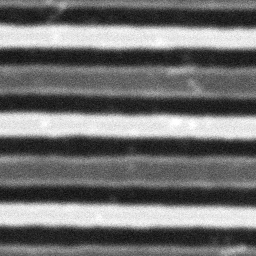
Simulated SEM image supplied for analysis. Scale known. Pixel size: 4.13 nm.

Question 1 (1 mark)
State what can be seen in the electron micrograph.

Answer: lines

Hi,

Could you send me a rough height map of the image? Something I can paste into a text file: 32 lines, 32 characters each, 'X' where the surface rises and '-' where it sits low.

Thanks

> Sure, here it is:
XXXXXXXXXXXXXXXXXXXXXXXXXXXXXXXX
--------------------------------
--------------------------------
XXXXXXXXXXXXXXXXX---------------
XXXXXXXXXXXXXXXXXXXXXXXXXXXXXXXX
XXXXXXXXXXXXXXXXXXXXXXXXXXXXXXXX
--------------------------------
--------------------------------
XXXXXXXX----------X-------------
XXXXXXXXXXXXXXXXXXXXXXXXXXXXXXXX
XXXXXXXXXXXXXXXXXXXXXXXXXXXXXXXX
XXXXXXXXXXXXXXXXXXXXXXXXXXXXXXXX
--------------------------------
--------------------------------
XXXXXXXXXX----------------------
XXXXXXXXXXXXXXXXXXXXXXXXXXXXXXXX
XXXXXXXXXXXXXXXXXXXXXXXXXXXXXXXX
--------------------------------
--------------------------------
--------------------------------
XXXXXXXXXXXXXXXXXXXXXXXXXXXXXXXX
XXXXXXXXXXXXXXXXXXXXXXXXXXXXXXXX
XXXXXXXXXXXXXXXXXXXXXXXXXXXXXXXX
--------------------------------
--------------------------------
--------------------------------
XXXXXXXXXXXXXXXXXXXXXXXXXXXXXXXX
XXXXXXXXXXXXXXXXXXXXXXXXXXXXXXXX
--------------------------------
--------------------------------
--------------------------------
XXXXXXXXXXXXXXXXXXXXXXXXXXXXXXXX